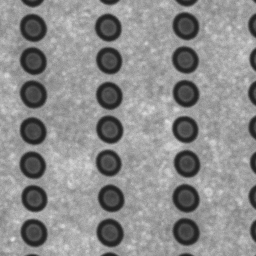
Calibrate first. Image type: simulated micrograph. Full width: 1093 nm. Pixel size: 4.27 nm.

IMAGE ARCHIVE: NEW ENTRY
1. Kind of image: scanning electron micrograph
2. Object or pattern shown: a regular array of ring-shaped grooves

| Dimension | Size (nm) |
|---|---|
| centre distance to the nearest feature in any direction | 142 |